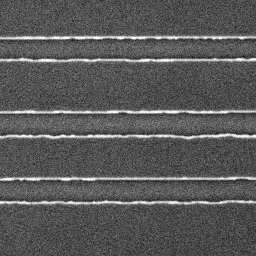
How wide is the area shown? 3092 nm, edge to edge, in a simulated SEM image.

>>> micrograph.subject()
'lines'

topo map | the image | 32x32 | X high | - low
XXXXXXXXXXXXXXXXXXXXXXXXXXXXXXXX
XXXXXXXXXXXXXXXXXXXXXXXXXXXXXXXX
XXXXXXXXXXXXXXXXXXXXXXXXXXXXXXXX
XXXXXXXXXXXXXXXXXXXXXXXXXXXXXXXX
XXXXXXXXXXXXXXXXXXXXXXXXXXXXXXXX
--------------------------------
--------------------------------
XXXX-XX-XXXXXXXXXXXXXXXXXXXXXXXX
XXXXXXXXXXXXXXXXXXXXXXXXXXXXXXXX
XXXXXXXXXXXXXXXXXXXXXXXXXXXXXXXX
XXXXXXXXXXXXXXXXXXXXXXXXXXXXXXXX
XXXXXXXXXXXXXXXXXXXXXXXXXXXXXXXX
XXXXXXXXXXXXXXXXXXXXXXXXXXXXXXXX
XXXXXXXXXXXXXXXXXXXXXXXXXXXXXXXX
--------------------------------
--------------------------------
--------------------------------
XXXXXXXXXXXXXXXXXXXXXXXXXXXXXXXX
XXXXXXXXXXXXXXXXXXXXXXXXXXXXXXXX
XXXXXXXXXXXXXXXXXXXXXXXXXXXXXXXX
XXXXXXXXXXXXXXXXXXXXXXXXXXXXXXXX
XXXXXXXXXXXXXXXXXXXXXXXXXXXXXXXX
--------------------------------
--------------------------------
--------------------------------
XXXXXXXXXXXXXXXXXXXXXXXXXXXXXXXX
XXXXXXXXXXXXXXXXXXXXXXXXXXXXXXXX
XXXXXXXXXXXXXXXXXXXXXXXXXXXXXXXX
XXXXXXXXXXXXXXXXXXXXXXXXXXXXXXXX
XXXXXXXXXXXXXXXXXXXXXXXXXXXXXXXX
XXXXXXXXXXXXXXXXXXXXXXXXXXXXXXXX
XXXXXXXXXXXXXXXXXXXXXXXXXXXXXXXX